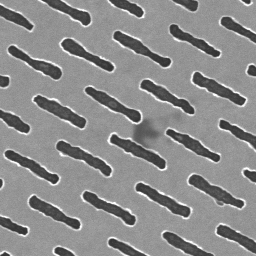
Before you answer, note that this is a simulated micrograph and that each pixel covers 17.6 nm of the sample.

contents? a regular array of holes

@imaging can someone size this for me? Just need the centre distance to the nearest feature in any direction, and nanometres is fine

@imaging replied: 911